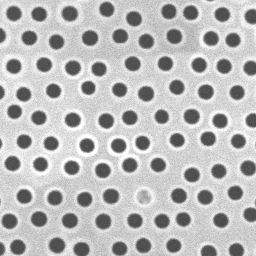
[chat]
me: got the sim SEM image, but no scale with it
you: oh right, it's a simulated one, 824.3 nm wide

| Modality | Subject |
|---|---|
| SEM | a regular array of holes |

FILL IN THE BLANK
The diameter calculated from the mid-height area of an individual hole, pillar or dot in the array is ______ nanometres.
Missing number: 49.7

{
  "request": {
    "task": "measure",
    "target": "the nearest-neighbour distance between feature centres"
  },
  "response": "0.0838 µm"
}